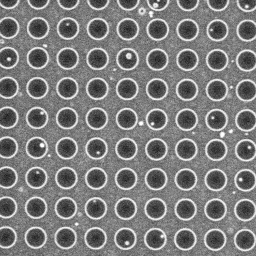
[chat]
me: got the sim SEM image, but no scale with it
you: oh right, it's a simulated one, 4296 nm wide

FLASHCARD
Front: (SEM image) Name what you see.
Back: an array of small figures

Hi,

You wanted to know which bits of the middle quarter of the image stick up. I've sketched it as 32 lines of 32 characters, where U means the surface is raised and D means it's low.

UUUDDDUUUUDDDDUUUUDDDUUUUDDDDUUU
DDDDDDDDDDDDDDDDDDDDDDDDDDDDDDDU
DDDDDDDDDDDDDDDDDDDDDDDDDDDDDDDD
DDDDDDDDDDDDDDDDDDDDDDDDDDDDDDDD
UUUDDDUUUUDDDDUUUUDDDUUUUDDDDUUU
UUUDDDUUUUUDDUUUUUDDDUUUUUDDUUUU
UUUDDDUUUUUDDUUUUUDDDUUUUUDDUUUU
UUUDDDUUUUUDDUUUUUDDDUUUUUDDUUUU
UUDDDDDUUUDDDDUUUDDDDDUUUDDDDUUU
DDDDDDDDDDDDDDDDDDDDDDDDDDDDDDDD
DDDDDDDDDDDDDDDDDDDDDDDDDDDDDDDD
UUDDDDDUUUDDDDUUUDDDDDUUDDDDDDUU
UUUDDDUUUUUDDUUUUUDDDUUUUDDDUUUU
UUUDDDUUUUUDDUUUUUDDDUUUUUDDUUUU
UUUDDDUUUUUDDUUUUUDDDUUUUUDDUUUU
UUDDDDUUUUDDDDUUUUDDDUUUUDDDDUUU
DDDDDDDDDDDDDDDDDDDDDDDDDDDDDDUD
DDDDDDDDDDDDDDDDDDDDDDDDDDDDDDDD
UDDDDDDDDDDDDDDDDDDDDDDDDDDDDDDD
UUUDDDUUUUDDDDUUUUDDDUUUUDDDDUUU
UUUDDDUUUUUDDUUUUUDDDUUUUUDDUUUU
UUUDDDUUUUUDDUUUUUDDDUUUUUDDUUUU
UUUDDDUUUUDDDUUUUUDDDUUUUDDDUUUU
UUDDDDDUUDDDDDUUUDDDDUUUUDDDDUUU
DDDDDDDDDDDDDDDDDDDDDDDDDDDDDDDD
DDDDDDDDDDDDDDDDDDDDDDDDDDDDDDDD
UUDDDDDUUUDDDDUUUDDDDDUUDDDDDUUU
UUUDDDUUUUDDDUUUUUDDDUUUUDDDUUUU
UUUDDUUUUUUDDUUUUUDDUUUUUUDDUUUU
UUUDDUUUUUUDDUUUUUDDUUUUUUDDUUUU
UUDDDDUUUUDDDDUUUDDDDUUUUDDDUUUU
DDDDDDDDDDDDDDDDDDDDDDDDDDDDDDDD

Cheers